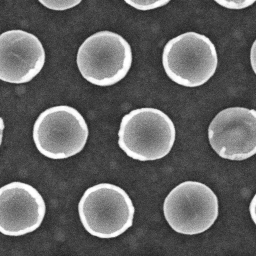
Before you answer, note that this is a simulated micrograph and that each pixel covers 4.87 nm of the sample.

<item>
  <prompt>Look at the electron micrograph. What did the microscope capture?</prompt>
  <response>raised bodies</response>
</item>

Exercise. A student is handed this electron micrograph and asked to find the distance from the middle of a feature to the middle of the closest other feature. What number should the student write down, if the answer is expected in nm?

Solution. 417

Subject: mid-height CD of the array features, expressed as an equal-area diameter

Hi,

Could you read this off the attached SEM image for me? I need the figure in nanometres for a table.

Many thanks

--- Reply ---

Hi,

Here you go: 260